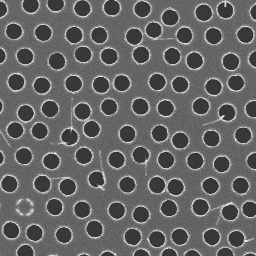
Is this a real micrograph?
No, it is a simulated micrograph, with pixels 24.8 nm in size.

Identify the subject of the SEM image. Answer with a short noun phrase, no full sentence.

a regular array of holes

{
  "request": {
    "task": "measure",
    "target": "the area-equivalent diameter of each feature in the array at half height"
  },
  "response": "400 nm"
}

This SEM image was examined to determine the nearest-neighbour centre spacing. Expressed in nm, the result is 583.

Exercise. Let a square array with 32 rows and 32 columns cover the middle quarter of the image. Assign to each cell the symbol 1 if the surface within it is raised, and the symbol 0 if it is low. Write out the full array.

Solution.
11111111111111111111111111111110
11111111111111111111111111111111
11111111111111111111111011111111
10001111001110001111110001110011
00001110000100001111100001100001
00001110000100001111110001100001
10001111000111011111111011110001
11111111111111111111111111111111
11111111111111111111111111111111
11111111110001111000011100011111
11100011100001111000011000011111
11100001100001111000011000011111
11100001110011111100111100011111
11110011111111111111111111111111
11111100111111111111111111111111
11111000011111100111111001111111
00111000011111000011110000111111
00011000011111000011110000110011
00001111111111000011110000100001
00011111111111101111111111100001
11111111111111111111111111110001
11110011111111111100011111111111
11100001111100111000011100011111
11100001111000011000011100001110
11110011111000011100111100001110
11111111111100011111111100011110
11111111111111111111111111111111
11111110001111111111111111111111
11111100001111100111110011111111
00011100001111000011100001000111
00011110111111000011100000000011
00011111111111000111110001000011